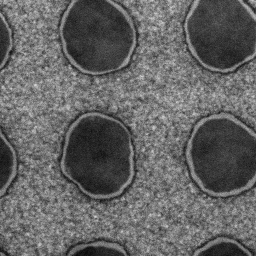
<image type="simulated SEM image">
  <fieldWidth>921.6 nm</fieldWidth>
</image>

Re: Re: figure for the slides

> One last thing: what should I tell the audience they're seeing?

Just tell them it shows raised bodies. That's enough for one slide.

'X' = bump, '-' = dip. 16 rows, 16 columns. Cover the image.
----XXX-----XXX-
----XXXX----XXXX
X---XXXX----XXXX
----XXXX----XXXX
-----XX---------
----------------
----------------
-----XX------XX-
----XXXX----XXXX
X---XXXX----XXXX
X---XXXX----XXXX
X----XXX-----XXX
----------------
----------------
----------------
-----XX------XX-